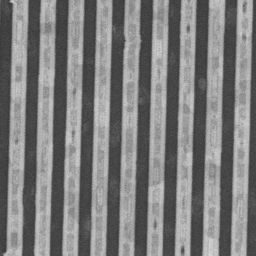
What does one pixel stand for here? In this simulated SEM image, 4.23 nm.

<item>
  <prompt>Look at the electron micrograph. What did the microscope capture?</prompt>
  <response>parallel lines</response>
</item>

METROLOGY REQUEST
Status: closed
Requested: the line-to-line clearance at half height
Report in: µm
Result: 0.0709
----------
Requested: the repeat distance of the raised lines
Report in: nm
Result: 119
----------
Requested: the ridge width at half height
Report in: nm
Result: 48.7